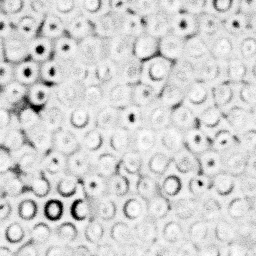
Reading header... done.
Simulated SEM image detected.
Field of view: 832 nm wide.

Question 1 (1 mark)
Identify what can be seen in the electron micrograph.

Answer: a regular array of raised bodies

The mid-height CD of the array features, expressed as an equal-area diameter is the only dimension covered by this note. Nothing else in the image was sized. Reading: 46.8 nanometers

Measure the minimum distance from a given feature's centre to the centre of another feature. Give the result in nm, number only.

55.4